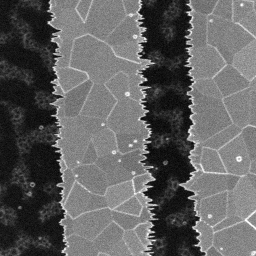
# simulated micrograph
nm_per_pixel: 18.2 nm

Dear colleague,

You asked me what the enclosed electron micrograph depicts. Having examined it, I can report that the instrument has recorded one or a few lines or trenches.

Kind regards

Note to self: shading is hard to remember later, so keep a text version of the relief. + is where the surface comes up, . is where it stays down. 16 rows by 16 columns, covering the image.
...++++++...++++
...++++++...++++
...++++++...++++
....+++++...++++
...++++++...++++
...++++++...++++
....+++++...++++
....+++++...++++
...++++++...++++
....+++++...++++
....+++++...++++
....+++++...++++
....+++++...++++
....+++++...++++
....+++++...++++
....+++++....+++